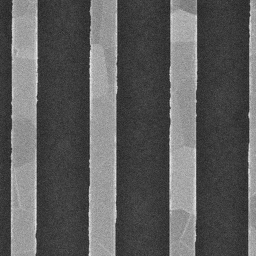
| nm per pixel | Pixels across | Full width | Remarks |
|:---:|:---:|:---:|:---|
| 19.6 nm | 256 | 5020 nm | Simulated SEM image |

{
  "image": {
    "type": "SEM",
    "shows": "lines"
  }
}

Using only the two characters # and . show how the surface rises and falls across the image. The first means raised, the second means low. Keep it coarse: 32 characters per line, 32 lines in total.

..###......####......####......#
..###......####......####......#
..###......####......####......#
..###......####......####......#
..###......####......####......#
..###......####......####......#
..###......####......####......#
..###......####......####......#
..###......####......####......#
..###......###.......####......#
..###......###.......####......#
..###......###.......####......#
..##.......###.......###.......#
..##.......###.......###.......#
..##.......###.......###.......#
..##.......###.......###.......#
.###.......###.......###.......#
.###.......###.......###.......#
..##.......###.......###.......#
.###.......###.......###.......#
.###.......###.......###.......#
.###.......###.......###.......#
.###.......###.......###.......#
.###.......###.......###.......#
.###.......###.......###.......#
.###.......###.......###.......#
.###.......###.......###.......#
.###.......###.......###.......#
.###.......###.......###.......#
.###.......###.......###.......#
.###.......###.......###.......#
.###.......###.......###.......#